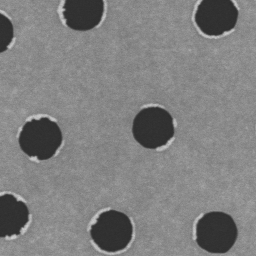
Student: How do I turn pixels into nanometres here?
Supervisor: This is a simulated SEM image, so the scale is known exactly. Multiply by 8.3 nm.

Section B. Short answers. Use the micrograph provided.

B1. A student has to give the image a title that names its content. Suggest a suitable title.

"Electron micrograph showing holes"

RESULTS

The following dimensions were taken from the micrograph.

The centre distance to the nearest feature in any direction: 895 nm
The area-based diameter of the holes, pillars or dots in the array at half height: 41.8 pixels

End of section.